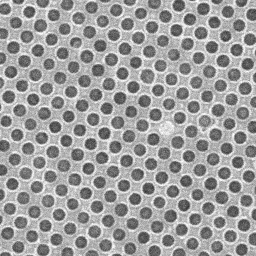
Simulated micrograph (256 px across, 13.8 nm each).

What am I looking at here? a regular array of holes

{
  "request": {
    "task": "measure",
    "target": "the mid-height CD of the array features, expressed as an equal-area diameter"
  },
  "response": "13.4 px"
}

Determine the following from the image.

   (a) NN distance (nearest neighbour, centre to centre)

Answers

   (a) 236 nm